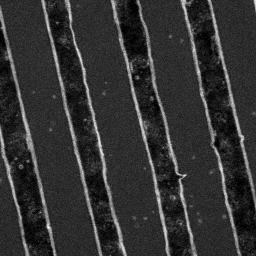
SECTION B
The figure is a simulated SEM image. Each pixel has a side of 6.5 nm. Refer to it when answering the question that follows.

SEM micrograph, one or a few lines or trenches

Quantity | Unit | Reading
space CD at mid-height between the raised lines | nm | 280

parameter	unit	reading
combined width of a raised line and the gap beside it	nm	447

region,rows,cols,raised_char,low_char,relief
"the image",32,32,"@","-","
-----@@@------@@@------@@@------
------@@@-----@@@@-----@@@@-----
------@@@------@@@-----@@@@-----
------@@@------@@@------@@@-----
@-----@@@------@@@------@@@-----
@------@@------@@@@-----@@@-----
@------@@@------@@@-----@@@@----
@------@@@------@@@-----@@@@----
@@-----@@@------@@@------@@@----
@@-----@@@@-----@@@------@@@----
@@------@@@-----@@@------@@@@---
@@------@@@------@@@-----@@@@---
@@@-----@@@------@@@------@@@---
@@@-----@@@------@@@------@@@---
@@@------@@@-----@@@------@@@---
@@@------@@@------@@@-----@@@@--
@@@@-----@@@------@@@-----@@@@--
@@@@-----@@@------@@@------@@@--
@@@@-----@@@@-----@@@------@@@--
-@@@------@@@------@@@-----@@@@-
-@@@------@@@------@@@------@@@-
-@@@@-----@@@------@@@------@@@-
-@@@@-----@@@------@@@@-----@@@-
--@@@------@@-------@@@-----@@@@
--@@@------@@@------@@@-----@@@@
--@@@@-----@@@------@@@-----@@@@
--@@@@-----@@@------@@@------@@@
---@@@------@@------@@@------@@@
---@@@------@@@------@@@-----@@@
---@@@------@@@------@@@-----@@@
---@@@@-----@@@------@@@------@@
---@@@@------@@@-----@@@------@@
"